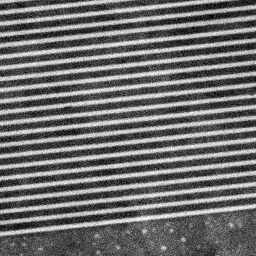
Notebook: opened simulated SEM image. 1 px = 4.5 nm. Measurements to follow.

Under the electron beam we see parallel lines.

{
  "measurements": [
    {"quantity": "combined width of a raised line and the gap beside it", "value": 49.5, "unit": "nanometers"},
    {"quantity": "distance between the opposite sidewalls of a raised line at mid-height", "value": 0.0134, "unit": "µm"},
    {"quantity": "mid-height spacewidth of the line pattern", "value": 7.82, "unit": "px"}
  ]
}